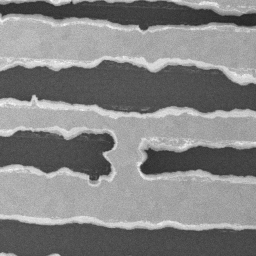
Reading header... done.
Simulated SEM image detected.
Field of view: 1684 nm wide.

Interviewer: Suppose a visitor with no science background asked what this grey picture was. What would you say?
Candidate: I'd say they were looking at one or a few lines or trenches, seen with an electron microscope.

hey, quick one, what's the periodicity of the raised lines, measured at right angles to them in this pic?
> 77.1 px